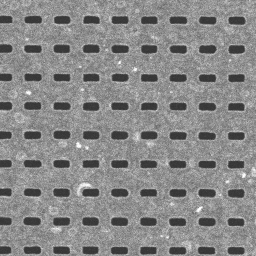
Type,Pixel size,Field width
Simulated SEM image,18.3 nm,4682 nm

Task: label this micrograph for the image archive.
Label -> a regular array of holes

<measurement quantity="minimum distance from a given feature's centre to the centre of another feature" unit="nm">520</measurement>